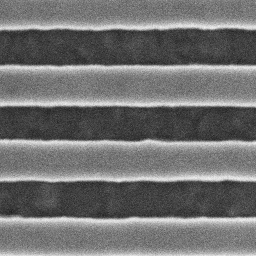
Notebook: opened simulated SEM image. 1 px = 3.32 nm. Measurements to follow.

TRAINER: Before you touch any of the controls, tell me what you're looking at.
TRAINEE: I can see lines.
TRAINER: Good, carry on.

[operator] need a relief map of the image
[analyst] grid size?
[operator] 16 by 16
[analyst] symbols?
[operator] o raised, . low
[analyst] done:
oooooooooooooooo
oooooooooooooooo
................
................
oooooooooooooooo
oooooooooooooooo
oooooooooooooooo
................
................
oooooooooooooooo
oooooooooooooooo
................
................
................
oooooooooooooooo
oooooooooooooooo